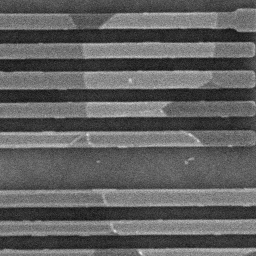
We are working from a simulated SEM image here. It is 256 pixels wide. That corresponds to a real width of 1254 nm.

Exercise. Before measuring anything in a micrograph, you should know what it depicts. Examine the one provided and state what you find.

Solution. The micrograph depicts wiring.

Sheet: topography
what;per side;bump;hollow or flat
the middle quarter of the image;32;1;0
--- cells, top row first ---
00000000000000000000000000000000
00000000000000000000000000000000
11111111111111111111111111111111
11111111111111111111111111111111
11111111111111111111111111111111
11111111111111111111111111111111
00000000000000000000000000000000
00000000000000000000000000000000
00000000000000000000000000000000
00000000000000000000000000000000
11111111111111111111111111111111
11111111111111111111111111111111
11111111111111111111111111111111
00000000000000000000000000000000
00000000000000000000000000000000
00000000000000000000000000000000
00000000000000000000000000000000
11111111111111111111111111111111
11111111111111111111111111111111
11111111111111111111111111111111
11111111111111111111100000000000
00000000000000000000000000000000
00000000000000000000000000000000
00000000000000000000000000000000
00000000000000000000000000000000
00000000000000000000000000000000
00000000000000000000000000000000
00000000000000000000000000000000
00000000000000000000000000000000
00000000000000000000000000000000
00000000000000000000000000000000
00000000000000000000000000000000